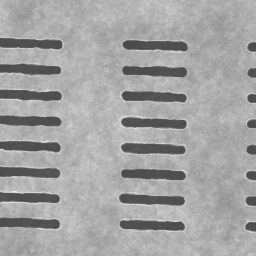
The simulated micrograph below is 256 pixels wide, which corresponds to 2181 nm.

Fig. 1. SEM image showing a regular array of holes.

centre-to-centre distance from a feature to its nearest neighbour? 218 nm